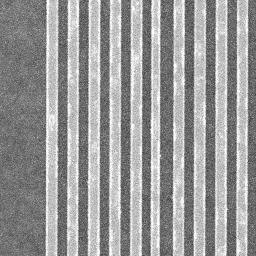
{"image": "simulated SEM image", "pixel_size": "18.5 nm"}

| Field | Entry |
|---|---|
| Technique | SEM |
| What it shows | parallel lines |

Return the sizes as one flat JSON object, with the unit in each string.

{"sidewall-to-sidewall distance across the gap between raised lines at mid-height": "215 nanometers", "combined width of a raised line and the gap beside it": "390 nm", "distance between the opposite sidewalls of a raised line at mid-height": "182 nm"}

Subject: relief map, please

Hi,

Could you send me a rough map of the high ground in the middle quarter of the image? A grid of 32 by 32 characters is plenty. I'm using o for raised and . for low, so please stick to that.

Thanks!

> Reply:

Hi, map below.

.oo...ooo...oo...oo...oo....oo..
.oo...ooo...oo...oo...oo....oo..
.oo...ooo...oo...oo...oo....oo..
.oo...ooo...oo...oo...oo....oo..
.oo...ooo...oo...oo...oo....oo..
.oo...ooo...oo...oo...oo....oo..
.oo...ooo...oo...oo...oo....oo..
.oo...ooo...oo...oo...oo....oo..
.oo...ooo...oo...oo...oo....oo..
.oo...ooo...oo...oo...oo....oo..
.oo...ooo...oo...oo...oo....oo..
.oo...ooo...oo...oo...oo....oo..
.oo...ooo...oo...oo...oo....oo..
.oo...ooo...oo...oo...oo....oo..
.oo...ooo...oo...oo...oo....oo..
.oo...ooo...oo...oo...oo...ooo..
.oo...ooo...oo...oo...oo...ooo..
.oo...ooo...oo...oo...oo....oo..
.oo...ooo...oo...oo...oo....oo..
.oo...ooo...oo...oo...oo....oo..
.oo...ooo...oo...oo...oo....oo..
.oo...ooo...oo...oo...oo....oo..
.oo...ooo...oo...oo...oo....oo..
.oo...ooo...oo...oo...oo...ooo..
.oo...ooo...oo...oo...oo....oo..
.oo...ooo...oo...oo...oo....oo..
.oo...ooo...oo...oo...oo....oo..
.oo...ooo...oo...oo...oo....oo..
.oo...ooo...oo...oo...oo....oo..
.oo...ooo...oo...oo...oo....oo..
.oo...ooo...oo...oo...oo....oo..
.oo...ooo...oo...oo...oo....oo..